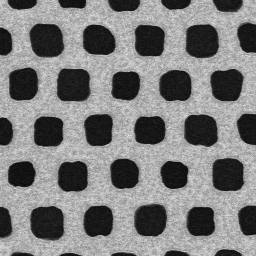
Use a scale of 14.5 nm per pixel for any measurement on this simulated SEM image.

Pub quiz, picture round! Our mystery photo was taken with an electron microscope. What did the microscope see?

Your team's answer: a regular array of holes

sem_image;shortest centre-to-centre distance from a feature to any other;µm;0.732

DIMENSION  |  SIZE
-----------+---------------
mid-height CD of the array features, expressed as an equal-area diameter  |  467 nanometres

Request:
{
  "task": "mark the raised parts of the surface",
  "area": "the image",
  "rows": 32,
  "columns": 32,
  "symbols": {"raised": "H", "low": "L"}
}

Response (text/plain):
HLLLHHHLLLLHHHLLLHHHLLLLHHHLLLHH
HHHHHHHHHHHHHHHHHHHHHHHHHHHHLHHH
HHHHHHHHHHHHHHHHHHHHHHHHHHHHHHHH
HHHHLLLHHHHLLHHHHLLLHHHHLLLHHHLL
LHHHLLLLHHLLLLHHHLLLLHHLLLLHHHLL
LHHHLLLLHHLLLLHHHLLLLHHLLLLHHHLL
LHHHLLLLHHHLLLHHHLLLHHHLLLLHHHHL
HHHHHHHHHHHHHHHHHHHHHHHHHHHHHHHH
HHHHHHHHHHHHHHHHHHHHHHHHHHHHHHHH
HLLLLHHLLLLHHHLLLHHHLLLLHHLLLLHH
HLLLLHHLLLLHHHLLLLHHLLLLHHLLLLHH
HLLLLHHLLLLHHHLLLHHHLLLLHHHLLLHH
HHLHHHHHLLHHHHHHHHHHHLLHHHHLLHHH
HHHHHHHHHHHHHHHHHHHHHHHHHHHHHHHH
HHHHHHHHHHHLLLHHHHHHHHHHLLHHHHLL
LHHHLLLLHHHLLLHHHLLLLHHLLLLHHHLL
LLHHLLLLHHHLLLHHHLLLLHHLLLLHHHLL
LHHHLLLLHHHLLLHHHLLLHHHLLLLHHHLL
HHHHHHHHHHHHHHHHHHHHHHHHHHHHHHHH
HHHHHHHHHHHHHHHHHHHHHHHHHHHHHHHH
HHLLHHHHLLLHHHLLLHHHHLLHHHHLLLHH
HLLLHHHLLLLHHHLLLHHHLLLHHHLLLLLH
HLLLHHHLLLLHHHLLLHHHLLLHHHHLLLHH
HHHHHHHHLLLHHHHLHHHHHLHHHHHLLLHH
HHHHHHHHHHHHHHHHHHHHHHHHHHHHHHHH
HHHHHHHHHHHHHHHHHHHHHHHHHHHHHHHH
LHHHLLLLHHHLLLHHHLLLLHHHLLLHHHLL
LHHHLLLLHHLLLLHHHLLLLHHLLLLHHHLL
LHHHLLLLHHLLLLHHHLLLLHHLLLLHHHLL
LHHHLLLLHHHLHHHHHHLLHHHHLLHHHHHH
HHHHHHHHHHHHHHHHHHHHHHHHHHHHHHHH
HHHHHHHHHHHHHHHHHHHHHLLHHHHLLLHH